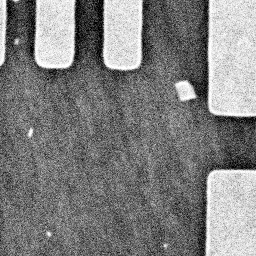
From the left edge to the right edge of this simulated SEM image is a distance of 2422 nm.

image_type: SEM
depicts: wiring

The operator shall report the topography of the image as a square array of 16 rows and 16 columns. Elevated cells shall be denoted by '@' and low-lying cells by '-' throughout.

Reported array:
--@@@--@@----@@@
--@@@--@@----@@@
--@@@--@@----@@@
--@@@--@@----@@@
-------------@@@
-------------@@@
-------------@@@
----------------
----------------
----------------
----------------
-------------@@@
-------------@@@
-------------@@@
-------------@@@
-------------@@@